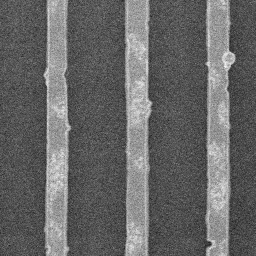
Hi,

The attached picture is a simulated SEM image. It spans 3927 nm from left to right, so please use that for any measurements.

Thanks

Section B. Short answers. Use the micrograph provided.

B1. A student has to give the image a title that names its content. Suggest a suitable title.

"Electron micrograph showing one or a few lines or trenches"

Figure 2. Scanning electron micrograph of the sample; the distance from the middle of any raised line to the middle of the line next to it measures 1.24 micrometres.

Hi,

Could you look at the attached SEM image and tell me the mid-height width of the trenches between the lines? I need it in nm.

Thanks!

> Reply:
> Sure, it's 928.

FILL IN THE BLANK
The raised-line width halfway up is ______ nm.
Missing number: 305